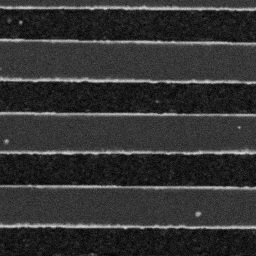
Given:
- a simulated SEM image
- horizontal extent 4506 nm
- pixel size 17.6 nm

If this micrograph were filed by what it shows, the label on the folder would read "lines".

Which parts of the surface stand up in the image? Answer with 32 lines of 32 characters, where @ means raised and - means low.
@@@@@@@@@@@@@@@@@@@@@@@@@@@@@@@@
--------------------------------
--------------------------------
--------------------------------
--------------------------------
@@@@@@@@@@@@@@@@@@@@@@@@@@@@@@@@
@@@@@@@@@@@@@@@@@@@@@@@@@@@@@@@@
@@@@@@@@@@@@@@@@@@@@@@@@@@@@@@@@
@@@@@@@@@@@@@@@@@@@@@@@@@@@@@@@@
@@@@@@@@@@@@@@@@@@@@@@@@@@@@@@@@
--------------------------------
--------------------------------
--------------------------------
--------------------------------
@@@@@@@@@@@@@@@@@@@@@@@@@@@@@@@@
@@@@@@@@@@@@@@@@@@@@@@@@@@@@@@@@
@@@@@@@@@@@@@@@@@@@@@@@@@@@@@@@@
@@@@@@@@@@@@@@@@@@@@@@@@@@@@@@@@
@@@@@@@@@@@@@@@@@@@@@@@@@@@@@@@@
--------------------------------
--------------------------------
--------------------------------
--------------------------------
@@@@@@@@@@@@@@@@@@@@@@@@@@@@@@@-
@@@@@@@@@@@@@@@@@@@@@@@@@@@@@@@@
@@@@@@@@@@@@@@@@@@@@@@@@@@@@@@@@
@@@@@@@@@@@@@@@@@@@@@@@@@@@@@@@@
@@@@@@@@@@@@@@@@@@@@@@@@@@@@@@@@
--------------------@--@@@@@@@@@
--------------------------------
--------------------------------
--------------------------------